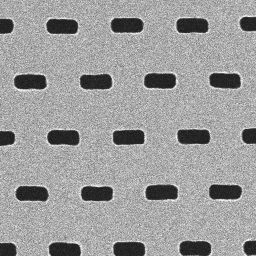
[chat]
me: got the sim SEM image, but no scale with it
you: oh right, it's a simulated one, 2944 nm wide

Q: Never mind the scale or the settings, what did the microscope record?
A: a regular array of holes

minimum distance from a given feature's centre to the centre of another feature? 736 nm